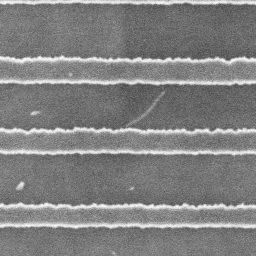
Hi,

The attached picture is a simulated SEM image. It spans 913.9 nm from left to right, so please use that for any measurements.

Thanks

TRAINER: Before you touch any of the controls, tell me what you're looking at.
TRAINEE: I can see lines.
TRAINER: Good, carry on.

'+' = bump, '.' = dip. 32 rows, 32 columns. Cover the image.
................................
................................
................................
................................
................................
................................
................................
++++++++++++++++++++++++++++.+++
++++++++++++++++++++++++++++++++
++++++++++++++++++++++++++++++++
...................+........+...
................................
................................
................................
................................
................................
++++++++++++++++++++++++++++++++
++++++++++++++++++++++++++++++++
++++++++++++++++++++++++++++++++
................................
................................
................................
................................
................................
................................
................................
++++++++++++++++++++++++++++++++
++++++++++++++++++++++++++++++++
................................
................................
................................
................................